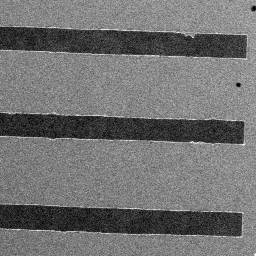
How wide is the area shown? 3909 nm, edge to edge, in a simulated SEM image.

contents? one or a few lines or trenches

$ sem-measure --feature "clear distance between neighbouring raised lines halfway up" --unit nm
967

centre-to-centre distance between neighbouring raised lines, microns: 1.36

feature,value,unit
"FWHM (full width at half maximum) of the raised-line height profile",375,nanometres